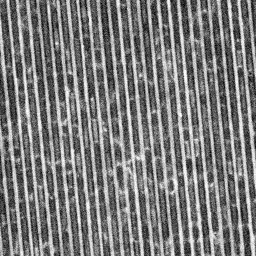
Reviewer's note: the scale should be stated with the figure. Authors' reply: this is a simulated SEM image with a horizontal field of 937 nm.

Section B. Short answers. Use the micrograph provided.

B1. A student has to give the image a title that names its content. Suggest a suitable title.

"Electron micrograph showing parallel lines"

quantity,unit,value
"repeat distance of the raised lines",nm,36.6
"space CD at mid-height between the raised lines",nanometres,27.3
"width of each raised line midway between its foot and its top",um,0.01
